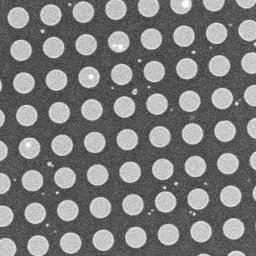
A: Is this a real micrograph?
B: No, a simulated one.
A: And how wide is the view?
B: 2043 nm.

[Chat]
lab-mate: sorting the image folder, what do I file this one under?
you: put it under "an array of small figures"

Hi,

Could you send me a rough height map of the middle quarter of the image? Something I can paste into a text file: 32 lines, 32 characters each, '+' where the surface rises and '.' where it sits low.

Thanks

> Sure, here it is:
.............+++.....++++...++++
....++++....+++++...+++++...++++
....+++++...+++++...+++++...++++
+...+++++...+++++....++++.....+.
....++++.....+++................
.....+++........................
................................
..............................++
..............++.....++++....+++
.....+++.....++++....+++++...+++
+....++++....+++++...+++++...+++
+...+++++....+++++...++++.....++
+....++++....++++...............
+.....++........................
................................
...............................+
...............++.....++++....++
......+++.....++++...+++++....++
+....+++++...+++++....++++....++
++...+++++...+++++....++++....++
++...+++++....++++.....++.......
++....+++.......................
+...............................
................................
.......................+++.....+
.......++......++++...+++++...++
++....+++++...+++++...+++++....+
++....+++++...+++++...+++++....+
+++...+++++...+++++....+++......
++.....+++......+...............
++..............................
................................